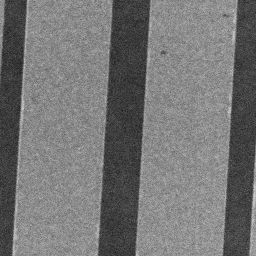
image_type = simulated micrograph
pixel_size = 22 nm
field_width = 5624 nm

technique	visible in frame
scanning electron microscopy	one or a few lines or trenches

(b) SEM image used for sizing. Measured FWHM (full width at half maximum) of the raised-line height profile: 1850 nanometers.